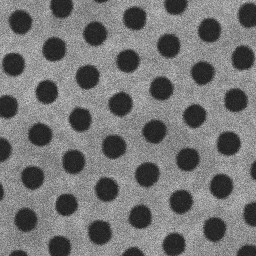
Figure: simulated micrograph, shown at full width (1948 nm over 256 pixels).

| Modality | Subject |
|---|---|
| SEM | a regular array of holes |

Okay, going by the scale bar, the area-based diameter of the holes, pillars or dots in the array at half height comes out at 187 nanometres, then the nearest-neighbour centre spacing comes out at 327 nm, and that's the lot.